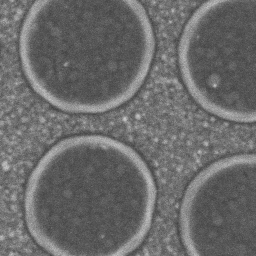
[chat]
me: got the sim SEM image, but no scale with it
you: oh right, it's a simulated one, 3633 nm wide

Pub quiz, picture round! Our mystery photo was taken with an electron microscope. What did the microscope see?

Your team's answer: raised bodies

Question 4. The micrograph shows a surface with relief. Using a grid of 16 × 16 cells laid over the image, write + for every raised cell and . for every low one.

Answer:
..+++++++....+++
..+++++++...++++
.++++++++...++++
.++++++++..+++++
..+++++++...++++
..++++++....++++
....+++......+++
................
................
...+++++........
..+++++++....+++
..+++++++...++++
..++++++++..++++
..+++++++...++++
..+++++++...++++
...+++++....++++